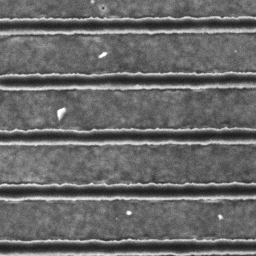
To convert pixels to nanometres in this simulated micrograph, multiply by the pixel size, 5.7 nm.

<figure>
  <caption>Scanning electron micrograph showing lines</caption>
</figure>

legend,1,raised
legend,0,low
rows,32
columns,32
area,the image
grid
00000000000000000000000000000000
00000000000000000000000000000000
11111111111111111111111111111111
11111111111111111111111111111111
00000000000000000000000000000000
00000000000000000000000000000000
00000000000000000000000000000000
00000000000000000000000000000000
00000000000000000000000000000000
11111111111111111111111111111111
11111111111111111111111111111111
00000000000000000000000000000000
00000000000000000000000000000000
00000000000000000000000000000000
00000000000000000000000000000000
00000000000000000000000000000000
11111111111111111111111111111111
11111111111111111111111111111111
00000000000000000000000000000000
00000000000000000000000000000000
00000000000000000000000000000000
00000000000000000000000000000000
00000000000000000000000000000000
11111111111111111111111111111111
11111111111111111111111111111111
00000000000000000000000000000000
00000000000000000000000000000000
00000000000000000000000000000000
00000000000000000000000000000000
00000000000000000000000000000000
11111111111111111111111111111111
11111111111111111111111111111111